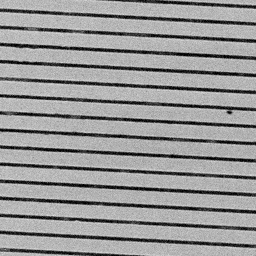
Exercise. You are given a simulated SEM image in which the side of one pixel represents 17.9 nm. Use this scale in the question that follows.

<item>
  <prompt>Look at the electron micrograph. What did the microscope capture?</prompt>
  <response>parallel lines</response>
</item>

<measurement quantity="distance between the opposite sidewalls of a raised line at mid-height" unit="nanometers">222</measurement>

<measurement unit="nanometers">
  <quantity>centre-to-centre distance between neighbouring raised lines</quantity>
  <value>306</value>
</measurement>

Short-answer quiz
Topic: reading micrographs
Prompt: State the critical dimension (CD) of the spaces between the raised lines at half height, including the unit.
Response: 82.9 nm